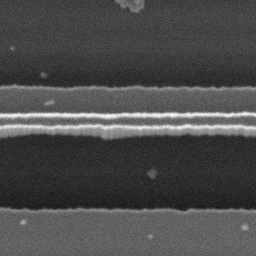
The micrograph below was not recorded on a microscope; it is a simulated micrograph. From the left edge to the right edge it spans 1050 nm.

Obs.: lines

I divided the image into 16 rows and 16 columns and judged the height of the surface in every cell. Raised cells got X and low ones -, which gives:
----------------
----------------
----------------
----------------
----------------
XXX--XX-X-XX--X-
XXXXXXXXXXXXXXXX
XXXXXXXXXXXXXXXX
----------------
----------------
----------------
----------------
----------------
XXXXXXXXXXXXXXXX
XXXXXXXXXXXXXXXX
XXXXXXXXXXXXXXXX